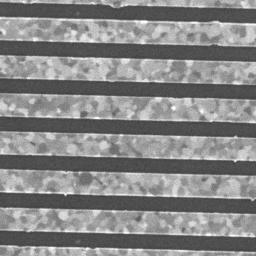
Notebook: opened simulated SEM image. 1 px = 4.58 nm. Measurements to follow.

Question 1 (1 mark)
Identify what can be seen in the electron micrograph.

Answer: parallel lines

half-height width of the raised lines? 101 nm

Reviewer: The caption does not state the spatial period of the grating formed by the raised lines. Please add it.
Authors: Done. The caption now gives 174 nm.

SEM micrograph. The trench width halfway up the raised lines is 73.2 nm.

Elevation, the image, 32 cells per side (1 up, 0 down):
00000000000001111111111111111111
00000000000000000000000000000000
11111111000000000000000000000000
11111111111111111111111111111111
11111111111111111111111111111111
00000000000000000000001111111111
00000000000000000000000000000000
11111111111111111111100000000000
11111111111111111111111111111111
11111111111111111111111111111111
00000000000000000000000000000001
00000000000000000000000000000000
11111111111111111111111111111100
11111111111111111111111111111111
01111111111111111111111111111111
00000000000000000000000000000000
10000000000000000000000000000000
11111111111111111111111111111111
11111111111111111111111111111111
00000000001111111111111111111111
00000000000000000000000000000000
11111111100000000000000000000000
11111111111111111111111111111111
11111111111111111111111111111111
00000000000000000001000111111111
00000000000000000000000000000000
11111111111111111100000000000000
11111111111111111111111111111111
11111111111111111111111111111111
00000000000000000000000000000000
00000000000000000000000000000000
11111111111111111111111111100000